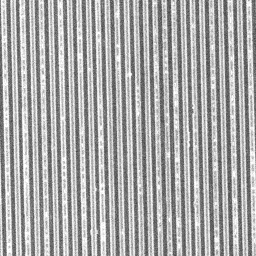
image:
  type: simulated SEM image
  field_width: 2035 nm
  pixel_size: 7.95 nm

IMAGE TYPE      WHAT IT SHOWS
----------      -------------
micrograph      parallel lines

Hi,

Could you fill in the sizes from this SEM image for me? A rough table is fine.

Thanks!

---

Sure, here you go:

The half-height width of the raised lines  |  4.49 pixels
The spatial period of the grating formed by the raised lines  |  74.9 nm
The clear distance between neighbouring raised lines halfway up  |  0.0427 microns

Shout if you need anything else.